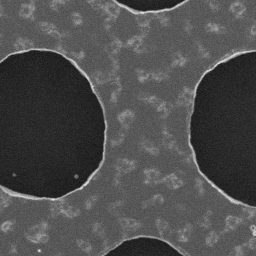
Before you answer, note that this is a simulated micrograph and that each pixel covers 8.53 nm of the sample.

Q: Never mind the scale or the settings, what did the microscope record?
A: holes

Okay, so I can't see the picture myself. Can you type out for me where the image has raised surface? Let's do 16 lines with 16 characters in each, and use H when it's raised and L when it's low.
HHHHHHHHLLLHHHHH
HHHHHHHHHHHHHHHH
HHHHHHHHHHHHHHHH
HLLLHHHHHHHHHHHL
LLLLLHHHHHHHHLLL
LLLLLLHHHHHHLLLL
LLLLLLHHHHHHLLLL
LLLLLLLHHHHHLLLL
LLLLLLLHHHHHLLLL
LLLLLLHHHHHHLLLL
LLLLLLHHHHHHLLLL
LLLLLHHHHHHHHLLL
HHHHHHHHHHHHHHHL
HHHHHHHHHHHHHHHH
HHHHHHHHHHHHHHHH
HHHHHHHLLLLHHHHH